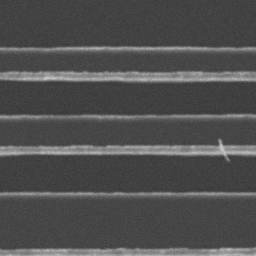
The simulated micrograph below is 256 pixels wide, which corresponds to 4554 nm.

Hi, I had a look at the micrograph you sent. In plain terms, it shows lines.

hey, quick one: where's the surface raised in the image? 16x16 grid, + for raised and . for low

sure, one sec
................
................
................
++++++++++++++++
++++++++++++++++
................
................
++++++++++++++++
++++++++++++++++
++++++++++++++++
................
................
++++++++++++++++
++++++++++++++++
++++++++++++++++
++++++++++++++++